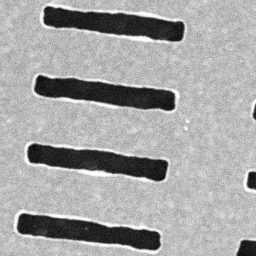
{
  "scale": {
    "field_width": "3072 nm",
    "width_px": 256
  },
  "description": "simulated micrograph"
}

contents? holes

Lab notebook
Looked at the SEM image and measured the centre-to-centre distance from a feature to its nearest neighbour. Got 833 nm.